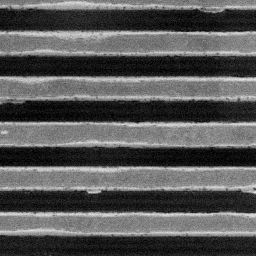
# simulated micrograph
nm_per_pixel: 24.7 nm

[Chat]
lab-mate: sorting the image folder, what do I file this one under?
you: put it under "lines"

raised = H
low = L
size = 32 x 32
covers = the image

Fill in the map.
HHHHHHHHHHHHHHHHHHHHHHHHHHHHHHHH
LLLLLLLLLLLLLLLLLLLLLLLLLLLLLLLL
LLLLLLLLLLLLLLLLLLLLLLLLLLLLLLLL
LLLLLLLLLLLLLLLLLLLLLLLLLLLLLLLL
HHHHHHHHHHHHHHHHHHHHHHHHHHHHHHHH
HHHHHHHHHHHHHHHHHHHHHHHHHHHHHHHH
HHHHHHHHHHHHHHHHHHHHHHHHHHHHHHHH
LLLLLLLLLLLLLLLLLLLLLLLLLLLLLLLL
LLLLLLLLLLLLLLLLLLLLLLLLLLLLLLLL
LLLLLLLLLLLLLLLLLLLLLLLLLLLLLLLL
HHHHHHHHHHHHHHHHHHHHHHHHHHHHHHHH
HHHHHHHHHHHHHHHHHHHHHHHHHHHHHHHH
LLLLLLLLLLLLLLLLLLLLLLLLLLLLLLLL
LLLLLLLLLLLLLLLLLLLLLLLLLLLLLLLL
LLLLLLLLLLLLLLLLLLLLLLLLLLLLLLLL
HHHHHHHHHHHHHHHHHHHHHHHHHHHHHHHH
HHHHHHHHHHHHHHHHHHHHHHHHHHHHHHHH
HHHHHHHHHHHHHHHHHHHHHHHHHHHHHHHH
LLLLLLLLLLLLLLLLLLLLLLLLLLLLLLLL
LLLLLLLLLLLLLLLLLLLLLLLLLLLLLLLL
LLLLLLLLLLLLLLLLLLLLLLLLLLLLLLLL
HHHHHHHHHHHHHHHHHHHHHHHHHHHHHHHH
HHHHHHHHHHHHHHHHHHHHHHHHHHHHHHHH
HHHHHHHHHHHHHHHHHHHHHHHHHHHHHHHH
LLLLLLLLLLLLLLLLLLLLLLLLLLLLLLLL
LLLLLLLLLLLLLLLLLLLLLLLLLLLLLLLL
LLLLLLLLLLLLLLLLLLLLLLLLLLLLLLLL
HHHHHHHHHHHHHHHHHHHHHHHHHHHHHHHH
HHHHHHHHHHHHHHHHHHHHHHHHHHHHHHHH
LLLLLLLLLLLLLLLLLLLLLLLLLLLLLLLL
LLLLLLLLLLLLLLLLLLLLLLLLLLLLLLLL
LLLLLLLLLLLLLLLLLLLLLLLLLLLLLLLL